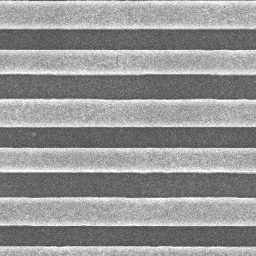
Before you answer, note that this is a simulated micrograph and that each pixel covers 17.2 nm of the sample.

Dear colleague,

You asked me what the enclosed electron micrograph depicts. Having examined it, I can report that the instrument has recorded lines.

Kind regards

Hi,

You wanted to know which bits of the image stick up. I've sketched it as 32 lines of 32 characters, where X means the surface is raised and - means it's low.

XXXXXXXXXXXXXXXXXXXXXXXXXXXXXXXX
XXXXXXXXXXXXXXXXXXXXXXXXXXXXXXXX
XXXXXXXXXXXXXXXXXXXXXXXXXXXXXXXX
--------------------------------
--------------------------------
--------------------------------
XXXXXXXXXXXXXXXXXXXXXXXXXXXXXXXX
XXXXXXXXXXXXXXXXXXXXXXXXXXXXXXXX
XXXXXXXXXXXXXXXXXXXXXXXXXXXXXXXX
--------------------------------
--------------------------------
--------------------------------
--------------------------------
XXXXXXXXXXXXXXXXXXXXXXXXXXXXXXXX
XXXXXXXXXXXXXXXXXXXXXXXXXXXXXXXX
XXXXXXXXXXXXXXXXXXXXXXXXXXXXXXXX
--------------------------------
--------------------------------
--------------------------------
XXXXXXXXXXXXXXXXXXXXXXXXXXXXXXXX
XXXXXXXXXXXXXXXXXXXXXXXXXXXXXXXX
--------------XX-XX-XX--XXX-XXXX
--------------------------------
--------------------------------
--------------------------------
XXXXXXXXXXXXXXXXXXXXXXXXXXXXXXXX
XXXXXXXXXXXXXXXXXXXXXXXXXXXXXXXX
XXXXXXXXXXXXXXXXXXXXXXXXXXXXXXXX
--------------------------------
--------------------------------
--------------------------------
XXXXXXXXXXXXXXXXXXXXXXXXXXXXXXXX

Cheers